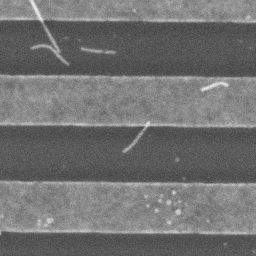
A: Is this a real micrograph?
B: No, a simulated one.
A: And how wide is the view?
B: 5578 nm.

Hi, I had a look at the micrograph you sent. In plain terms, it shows lines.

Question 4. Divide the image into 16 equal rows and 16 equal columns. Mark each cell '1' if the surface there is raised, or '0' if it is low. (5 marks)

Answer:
1111111111111111
0000000000000000
0000000000000000
0000000000000000
0000000000000000
1111111111111111
1111111111111111
1111111111111111
0000000000000000
0000000000000000
0000000000000000
1111111111111000
1111111111111111
1111111111111111
0000000111111111
0000000000000000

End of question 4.